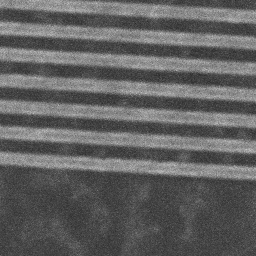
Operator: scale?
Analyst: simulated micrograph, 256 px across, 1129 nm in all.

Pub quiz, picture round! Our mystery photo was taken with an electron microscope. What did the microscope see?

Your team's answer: parallel lines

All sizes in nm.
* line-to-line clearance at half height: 63.3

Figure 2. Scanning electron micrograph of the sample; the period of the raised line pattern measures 115 nanometres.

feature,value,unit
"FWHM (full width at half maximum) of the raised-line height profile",52.3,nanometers